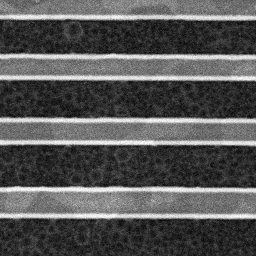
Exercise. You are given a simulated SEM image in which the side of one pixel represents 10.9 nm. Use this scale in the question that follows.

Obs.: one or a few lines or trenches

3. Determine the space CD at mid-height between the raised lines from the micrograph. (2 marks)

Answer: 460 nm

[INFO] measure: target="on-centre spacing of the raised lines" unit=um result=0.737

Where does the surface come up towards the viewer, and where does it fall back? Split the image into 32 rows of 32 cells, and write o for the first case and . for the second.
oooooooooooooooooooooooooooooooo
oooooooooooooooooooooooooooooooo
................................
................................
................................
................................
................................
oooooooooooooooooooooooooooooooo
oooooooooooooooooooooooooooooooo
oooooooooooooooooooooooooooooooo
................................
................................
................................
................................
................................
oooooooooooooooooooooooooooooooo
oooooooooooooooooooooooooooooooo
oooooooooooooooooooooooooooooooo
................................
................................
................................
................................
................................
................................
oooooooooooooooooooooooooooooooo
oooooooooooooooooooooooooooooooo
oooooooooooooooooooooooooooooooo
................................
................................
................................
................................
................................